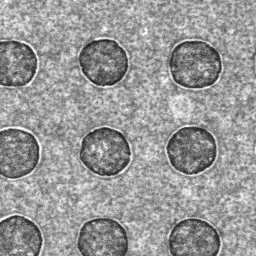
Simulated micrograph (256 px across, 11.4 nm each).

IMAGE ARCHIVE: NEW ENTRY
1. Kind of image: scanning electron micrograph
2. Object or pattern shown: holes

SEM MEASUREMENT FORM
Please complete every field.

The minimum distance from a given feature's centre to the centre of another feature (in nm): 980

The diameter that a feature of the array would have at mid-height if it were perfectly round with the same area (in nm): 566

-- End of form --